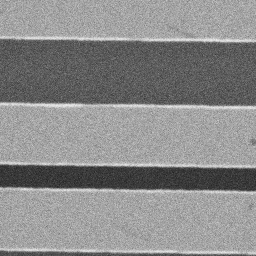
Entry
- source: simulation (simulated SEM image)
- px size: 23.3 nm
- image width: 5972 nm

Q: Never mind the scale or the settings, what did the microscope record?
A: lines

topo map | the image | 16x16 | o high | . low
oooooooooooooooo
oooooooooooooooo
........oooooooo
................
................
................
oo..............
oooooooooooooooo
oooooooooooooooo
oooooooooooooooo
................
................
oooooooooooooooo
oooooooooooooooo
oooooooooooooooo
oooooooooooooooo